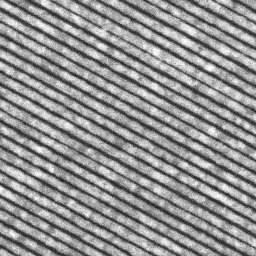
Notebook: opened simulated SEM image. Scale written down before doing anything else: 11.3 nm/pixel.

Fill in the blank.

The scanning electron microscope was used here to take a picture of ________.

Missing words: parallel lines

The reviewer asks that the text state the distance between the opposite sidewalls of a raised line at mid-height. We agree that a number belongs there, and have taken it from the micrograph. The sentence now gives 83 nm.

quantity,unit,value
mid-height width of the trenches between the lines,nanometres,42.1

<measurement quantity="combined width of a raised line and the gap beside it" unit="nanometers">124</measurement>